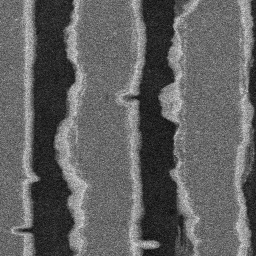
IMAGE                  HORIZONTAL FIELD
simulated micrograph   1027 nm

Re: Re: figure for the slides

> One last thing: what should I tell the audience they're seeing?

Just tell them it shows one or a few lines or trenches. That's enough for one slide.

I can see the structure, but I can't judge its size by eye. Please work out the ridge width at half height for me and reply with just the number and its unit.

255 nm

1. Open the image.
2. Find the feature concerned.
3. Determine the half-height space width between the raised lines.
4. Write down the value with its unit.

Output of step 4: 175 nm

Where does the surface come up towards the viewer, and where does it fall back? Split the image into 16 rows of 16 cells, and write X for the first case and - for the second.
XX---XXXX---XXX-
XX---XXXX--XXXX-
XX--XXXXX--XXXX-
XX---XXXX--XXXX-
XX---XXXX--XXXX-
XX---XXX---XXXX-
XX---XXX---XXXX-
XX--XXXX---XXXX-
XX--XXXX---XXXX-
XX--XXXX---XXXX-
XX--XXXX---XXXX-
XX---XXXX--XXXX-
XX---XXXX--XXXX-
XX---XXX----XXX-
X----XXX----XXX-
XX---XXXX---XXX-